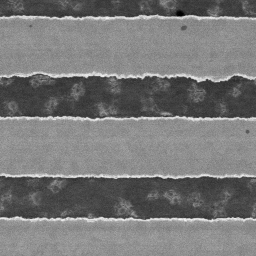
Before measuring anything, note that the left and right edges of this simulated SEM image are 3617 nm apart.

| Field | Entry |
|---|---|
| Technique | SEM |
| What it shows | one or a few lines or trenches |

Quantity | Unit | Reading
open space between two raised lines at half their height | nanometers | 592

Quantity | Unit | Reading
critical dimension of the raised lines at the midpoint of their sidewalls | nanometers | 832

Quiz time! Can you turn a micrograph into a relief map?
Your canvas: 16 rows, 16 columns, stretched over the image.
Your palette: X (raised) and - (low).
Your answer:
----------------
XXXXXXXXXXXXXXXX
XXXXXXXXXXXXXXXX
XXXXXXXXXXXXXXXX
XXXXXXXXXXXXXXXX
----------------
----------------
XXXXXXXXXXXXXXXX
XXXXXXXXXXXXXXXX
XXXXXXXXXXXXXXXX
XXXXXXXXXXXXXXXX
----------------
----------------
----------------
XXXXXXXXXXXXXXXX
XXXXXXXXXXXXXXXX